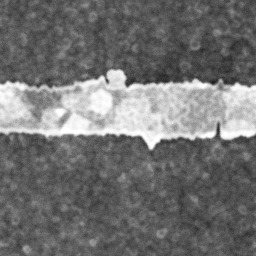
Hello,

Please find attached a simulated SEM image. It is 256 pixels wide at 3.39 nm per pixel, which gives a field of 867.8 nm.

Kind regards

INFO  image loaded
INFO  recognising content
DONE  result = one or a few lines or trenches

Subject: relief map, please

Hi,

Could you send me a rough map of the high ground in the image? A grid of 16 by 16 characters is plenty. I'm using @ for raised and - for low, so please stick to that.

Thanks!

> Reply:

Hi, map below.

----------------
----------------
----------------
----------------
----------------
@@--@@@@@@@@@@@-
@@@@@@@@@@@@@@@@
@@@@@@@@@@@@@@@@
---------@@-----
----------------
----------------
----------------
----------------
----------------
----------------
----------------